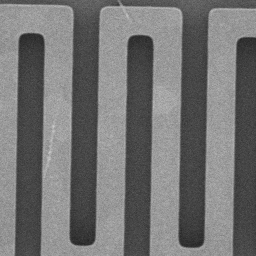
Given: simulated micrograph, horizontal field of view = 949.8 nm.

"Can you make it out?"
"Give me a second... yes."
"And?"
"groups of lines, slits or small figures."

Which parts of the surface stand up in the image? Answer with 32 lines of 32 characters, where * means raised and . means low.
................................
*********....**********...******
*********....**********...******
*********....**********...******
***..****....****.*****...******
**....***....***...****...****..
**....***...****...****...***...
**....***...****...****...***...
**....***...****...****...***...
**....***...****...****...***...
**....***...****...****...***...
**....***...****...****...***...
**....***...****...****...***...
**....***...****...****...***...
**....***...****...***....***...
**....***...****...***....***...
**...****...****...***....***...
**...****...****...***....***...
**...****...****...***....***...
**...****...****...***....***...
**...****...****...***....***...
**...****...****...***....***...
**...****...****...***....***...
**...****...****...***....***...
**...****...***....***....***...
**...****...***....***....***...
**...****...***....***....***...
**...****...***....***....***...
**...****...***....***....***...
**...****...***....***....***...
**...****...***....***...****...
**...**********....**********...